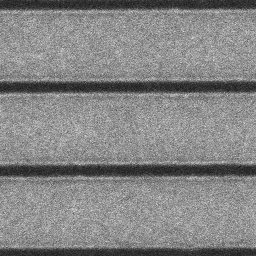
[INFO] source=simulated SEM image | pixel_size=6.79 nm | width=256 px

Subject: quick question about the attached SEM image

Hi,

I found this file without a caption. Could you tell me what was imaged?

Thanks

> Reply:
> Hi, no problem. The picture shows one or a few lines or trenches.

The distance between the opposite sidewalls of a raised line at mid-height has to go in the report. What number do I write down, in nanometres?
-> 106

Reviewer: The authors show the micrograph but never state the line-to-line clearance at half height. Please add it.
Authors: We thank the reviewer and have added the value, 455 nm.